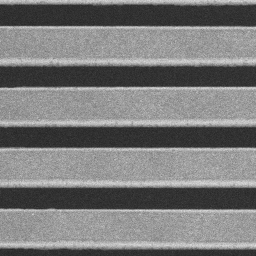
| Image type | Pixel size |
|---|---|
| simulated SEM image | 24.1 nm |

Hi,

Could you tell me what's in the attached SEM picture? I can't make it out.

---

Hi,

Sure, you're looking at lines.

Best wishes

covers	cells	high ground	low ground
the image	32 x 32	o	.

................................
................................
................................
oooooooooooooooooooooooooooooooo
oooooooooooooooooooooooooooooooo
oooooooooooooooooooooooooooooooo
oooooooooooooooooooooooooooooooo
oooooooooooooooooooooooooooooooo
................................
................................
................................
oooooooooooooooooooooooooooooooo
oooooooooooooooooooooooooooooooo
oooooooooooooooooooooooooooooooo
oooooooooooooooooooooooooooooooo
oooooooooooooooooooooooooooooooo
................................
................................
................................
oooooooooooooooooooooooooooooooo
oooooooooooooooooooooooooooooooo
oooooooooooooooooooooooooooooooo
oooooooooooooooooooooooooooooooo
................................
................................
................................
oooooooooooooooooooooooooooooooo
oooooooooooooooooooooooooooooooo
oooooooooooooooooooooooooooooooo
oooooooooooooooooooooooooooooooo
oooooooooooooooooooooooooooooooo
................................